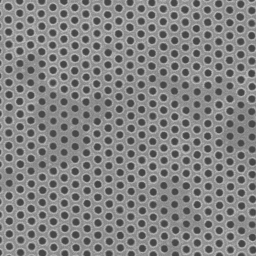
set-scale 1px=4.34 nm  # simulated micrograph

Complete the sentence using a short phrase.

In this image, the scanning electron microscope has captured a regular array of holes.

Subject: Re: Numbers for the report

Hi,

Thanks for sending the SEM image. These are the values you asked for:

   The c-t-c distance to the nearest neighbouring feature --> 12.3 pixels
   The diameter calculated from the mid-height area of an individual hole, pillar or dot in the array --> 32.5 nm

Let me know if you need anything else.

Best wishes